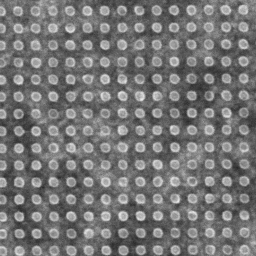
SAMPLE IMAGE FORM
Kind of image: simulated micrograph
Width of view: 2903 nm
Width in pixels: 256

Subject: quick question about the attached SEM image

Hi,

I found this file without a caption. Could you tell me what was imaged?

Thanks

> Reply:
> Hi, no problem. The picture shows a regular array of raised bodies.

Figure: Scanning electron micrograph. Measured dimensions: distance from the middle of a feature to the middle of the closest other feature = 0.193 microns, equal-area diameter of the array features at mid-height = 0.101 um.